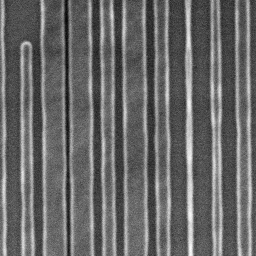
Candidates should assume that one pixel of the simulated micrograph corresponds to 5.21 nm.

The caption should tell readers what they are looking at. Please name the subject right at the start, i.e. groups of lines, slits or small figures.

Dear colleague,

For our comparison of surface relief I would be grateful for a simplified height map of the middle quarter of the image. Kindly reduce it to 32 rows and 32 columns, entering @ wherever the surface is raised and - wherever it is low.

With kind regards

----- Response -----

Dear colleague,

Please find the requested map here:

-@@@@@@---@@---@@@@@---@@@-----@
-@@@@@@---@@---@@@@@---@@@-----@
-@@@@@@---@@---@@@@@---@@@-----@
-@@@@@@---@@---@@@@@---@@@-----@
-@@@@@@---@@---@@@@@@--@@@-----@
--@@@@@---@@---@@@@@@--@@@-----@
--@@@@@---@@---@@@@@@--@@@-----@
--@@@@@---@@---@@@@@@--@@@-----@
--@@@@@---@@---@@@@@@--@@@-----@
--@@@@@---@@---@@@@@---@@@-----@
--@@@@@---@@---@@@@@---@@@-----@
--@@@@@---@@---@@@@@---@@@-----@
--@@@@@---@@---@@@@@---@@@-----@
--@@@@@---@@---@@@@@---@@@-----@
--@@@@@---@@---@@@@@---@@@-----@
--@@@@@---@@---@@@@@---@@@-----@
--@@@@@---@@---@@@@@@--@@@-----@
--@@@@@---@@---@@@@@@--@@@-----@
--@@@@@---@@---@@@@@@--@@@-----@
--@@@@@---@@---@@@@@@--@@@-----@
--@@@@@---@@---@@@@@@--@@@-----@
--@@@@@---@@---@@@@@@--@@@-----@
--@@@@@---@@---@@@@@@--@@@-----@
--@@@@@---@@---@@@@@@--@@@-----@
--@@@@@---@@---@@@@@@--@@@-----@
--@@@@@---@@---@@@@@@--@@@-----@
--@@@@@---@@@--@@@@@@--@@@-----@
--@@@@@---@@@--@@@@@@--@@@-----@
--@@@@@---@@@--@@@@@@--@@@-----@
--@@@@@---@@@--@@@@@@--@@@-----@
--@@@@@---@@@--@@@@@@--@@@-----@
--@@@@@---@@@--@@@@@@--@@@-----@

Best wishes